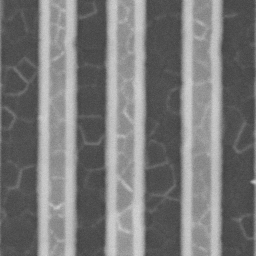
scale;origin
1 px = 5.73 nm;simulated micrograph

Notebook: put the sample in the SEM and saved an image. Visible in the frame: one or a few lines or trenches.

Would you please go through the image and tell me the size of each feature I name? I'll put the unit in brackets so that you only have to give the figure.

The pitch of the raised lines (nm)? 413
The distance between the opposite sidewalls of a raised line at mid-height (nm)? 149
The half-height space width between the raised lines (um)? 0.269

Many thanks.